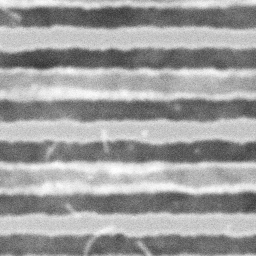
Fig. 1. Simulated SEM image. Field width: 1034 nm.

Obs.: lines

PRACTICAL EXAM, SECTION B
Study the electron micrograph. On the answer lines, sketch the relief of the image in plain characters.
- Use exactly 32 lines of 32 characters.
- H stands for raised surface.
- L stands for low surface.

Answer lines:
HHHHHHHHHHHHHHHHHHHHHHHHHHHHHLLL
LLLLLLLLLLLLLLLLLLLLLLLLLLLLLLLL
LLLLLLLLLLLLLLLLLLLLLLLLLLLLLLLL
HLLLLLHHHLLLLLLLLHHLLLLLHHLLLLLL
HHHHHHHHHHHHHHHHHHHHHHHHHHHHHHHH
HHHHHHHHHHHHHHHHHHHHHHHHHHHHHHHH
LLLLLLLLLLLLLLLLLLLLLLLLLLLLLLLL
LLLLLLLLLLLLLLLLLLLLLLLLLLLLLLLL
LLLLLLLLLLLLLLLLLLLLLLLLLLLLLLLL
HHHHHHHHHHHHHHHHHHHHHHHHHHHHHHHH
HHHHHHHHHHHHHHHHHHHHHHHHHHHHHHHH
HHHHHHHHHHHHHHHHHHHHHHHHHHHHHHHH
LLLLLLLLLLLLLLLLLLLLLLLLLLLLLLLL
LLLLLLLLLLLLLLLLLLLLLLLLLLLLLLLL
LLLLLLLLLLLLLLLLLLLLLLLLLLLLLLLL
HHHHHHHHHHHHHHHHHHHHHHHHHHHHHHHH
HHHHHHHHHHHHHHHHHHHHHHHHHHHHHHHH
LHHHHLLHHHHHHHLLLHHHHHHHLLLLLHHH
LLLLLLLLLLLLLLLLLLLLLLLLLLLLLLLL
LLLLLLLLLLLLLLLLLLLLLLLLLLLLLLLL
LLLLLLLHLLLLLLLLLLLLLLLLLHHHHHHH
HHHHHHHHHHHHHHHHHHHHHHHHHHHHHHHH
HHHHHHHHHHHHHHHHHHHHHHHHHHHHHHHH
HHHHHHHHHHHHHHHHHHHHHHHHHHHHHHHH
LLLLLLLLLLLLLLLLLLLLLLLLLLLLLLLL
LLLLLLLLLLLLLLLLLLLLLLLLLLLLLLLL
LLLLLLLLLLLLLLLLLLLLLLLLLLLLLLLL
HHHHHHHHHHHHHHHHHHHHHHHHHHHHHHHH
HHHHHHHHHHHHHHHHHHHHHHHHHHHHHHHH
LLLLLLLLLLLLLLLLHHLLLLLLLLLLLHLL
LLLLLLLLLLLLLLLLLLLLLLLLLLLLLLLL
LLLLLLLLLLLLLLLLLLLLLLLLLLLLLLLL